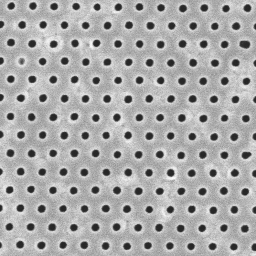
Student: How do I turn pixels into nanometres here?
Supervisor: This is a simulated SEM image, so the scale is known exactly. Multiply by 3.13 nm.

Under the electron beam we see a regular array of holes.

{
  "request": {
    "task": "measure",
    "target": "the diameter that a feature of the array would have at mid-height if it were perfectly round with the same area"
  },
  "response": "23.4 nm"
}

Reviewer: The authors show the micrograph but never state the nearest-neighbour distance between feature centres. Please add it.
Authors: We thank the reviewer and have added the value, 20.7 pixels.